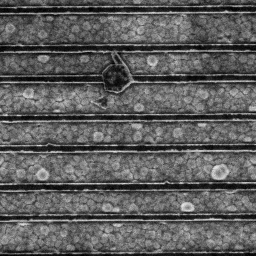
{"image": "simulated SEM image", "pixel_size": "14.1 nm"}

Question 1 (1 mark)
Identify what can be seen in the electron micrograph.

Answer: parallel lines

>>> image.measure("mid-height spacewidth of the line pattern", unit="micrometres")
0.427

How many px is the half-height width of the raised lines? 6.87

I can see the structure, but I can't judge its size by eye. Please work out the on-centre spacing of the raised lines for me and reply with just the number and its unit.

487 nanometers